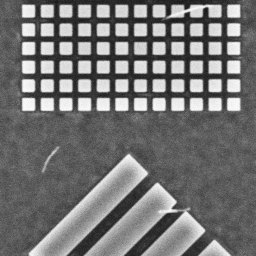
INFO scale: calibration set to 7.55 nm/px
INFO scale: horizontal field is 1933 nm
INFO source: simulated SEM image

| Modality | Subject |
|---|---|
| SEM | groups of lines, slits or small figures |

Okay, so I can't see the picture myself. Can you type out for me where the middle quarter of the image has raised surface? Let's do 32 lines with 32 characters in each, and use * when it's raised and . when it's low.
**..***.***..***..***.***..***..
**..***.***..***..***.***..***..
................................
................................
**..***.***..***..***.***..***..
**..***.***..***..***.***..***..
**..***.***..***..***.***..***..
................................
................................
**..***.***..***..***.***..***..
**..***.***..***..***.***..***..
**..***.***..***..***.***..***..
................................
................................
................................
................................
................................
................................
................................
................................
................................
................................
................................
...............**...............
..............****..............
.............******.............
............********............
...........**********...........
..........**********............
.........**********.............
........**********....**........
.......**********.....***.......